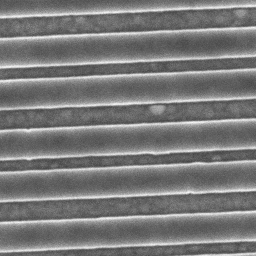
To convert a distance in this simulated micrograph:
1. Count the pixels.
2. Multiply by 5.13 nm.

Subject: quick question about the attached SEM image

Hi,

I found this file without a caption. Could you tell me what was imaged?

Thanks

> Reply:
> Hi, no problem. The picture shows parallel lines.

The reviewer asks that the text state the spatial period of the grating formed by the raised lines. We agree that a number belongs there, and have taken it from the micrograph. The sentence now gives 236 nm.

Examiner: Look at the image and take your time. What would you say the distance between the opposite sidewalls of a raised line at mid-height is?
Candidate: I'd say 154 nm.